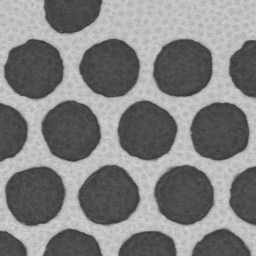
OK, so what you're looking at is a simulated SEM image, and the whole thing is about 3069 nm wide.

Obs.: a regular array of holes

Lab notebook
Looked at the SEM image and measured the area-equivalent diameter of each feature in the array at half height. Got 708 nanometers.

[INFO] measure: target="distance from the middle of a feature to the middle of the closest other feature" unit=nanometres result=868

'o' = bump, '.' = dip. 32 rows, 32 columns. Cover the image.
ooooo........ooooooooooooooooooo
oooooo......oooooooooooooooooooo
oooooo......oooooooooooooooooooo
ooooooo....ooooooooooooooooooooo
oooooooooooooooooooooooooooooooo
ooo...oooooo....ooooo....ooooo..
o......oooo......ooo......ooo...
o.......oo.......oo.......ooo...
........oo.......oo........oo...
o.......oo.......oo.......ooo...
o......oooo......ooo......ooo...
oo....oooooo....oooo.....ooooo..
oooooooooooooooooooooooooooooooo
..ooooo....ooooo....ooooo.....oo
...ooo......ooo......ooo.......o
...oo.......ooo.......oo.......o
...oo.......ooo.......oo.......o
...ooo......ooo.......oo.......o
...ooo......ooo......ooo.......o
..ooooo....oooooo...ooooo....ooo
oooooooooooooooooooooooooooooooo
oo.....ooooo....ooooo....ooooo..
o.......ooo......ooo......ooo...
o.......oo.......oo........oo...
o.......oo.......oo........oo...
o.......oo.......ooo.......oo...
o......ooo.......ooo......ooo...
oo....ooooo.....ooooo....ooooo..
oooooooooooooooooooooooooooooooo
..ooooo....oooooo....ooooo....oo
...ooo......ooo.......ooo......o
...ooo.......oo.......oo.......o